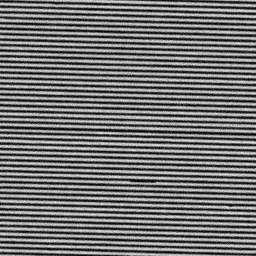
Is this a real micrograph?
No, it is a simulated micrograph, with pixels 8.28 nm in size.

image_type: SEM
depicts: parallel lines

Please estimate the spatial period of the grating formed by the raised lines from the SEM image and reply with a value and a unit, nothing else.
45.3 nm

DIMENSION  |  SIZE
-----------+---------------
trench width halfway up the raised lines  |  0.0228 microns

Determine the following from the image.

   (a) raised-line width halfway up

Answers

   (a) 2.75 px